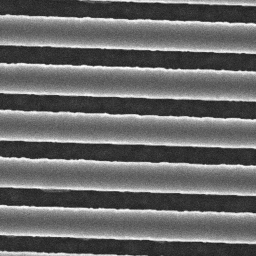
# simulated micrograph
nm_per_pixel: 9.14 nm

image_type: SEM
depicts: lines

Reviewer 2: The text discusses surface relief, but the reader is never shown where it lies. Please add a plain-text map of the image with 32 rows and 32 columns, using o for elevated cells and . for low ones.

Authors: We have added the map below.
............................oooo
................................
oooooooooooooooo................
oooooooooooooooooooooooooooooooo
oooooooooooooooooooooooooooooooo
.ooooooooooooooooooooooooooooooo
...........................ooooo
................................
ooooooooooooooooo...............
oooooooooooooooooooooooooooooooo
oooooooooooooooooooooooooooooooo
oooooooooooooooooooooooooooooooo
...............................o
................................
oooooooooooooooooooo............
oooooooooooooooooooooooooooooooo
oooooooooooooooooooooooooooooooo
.ooooooooooooooooooooooooooooooo
................................
................................
ooooooooooooooooooooooo.........
oooooooooooooooooooooooooooooooo
oooooooooooooooooooooooooooooooo
.....ooooooooooooooooooooooooooo
................................
................................
ooooooooooooooooooooo...........
oooooooooooooooooooooooooooooooo
oooooooooooooooooooooooooooooooo
......oooooooooooooooooooooooooo
................................
................................